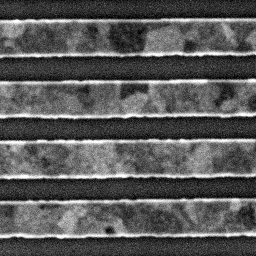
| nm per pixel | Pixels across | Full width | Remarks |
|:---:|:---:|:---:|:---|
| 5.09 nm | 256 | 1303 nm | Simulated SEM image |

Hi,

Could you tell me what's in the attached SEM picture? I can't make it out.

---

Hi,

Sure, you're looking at lines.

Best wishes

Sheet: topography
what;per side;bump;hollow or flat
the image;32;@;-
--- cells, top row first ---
--------------------------------
--------------------------------
--------------------@@@@@@@@@@@@
@@@@@@@@@@@@@@@@@@@@@@@@@@@@@@@@
@@@@@@@@@@@@@@@@@@@@@@@@@@@@@@@@
@@@@@@@@@@@@@@@@@@@@@@@@@@@@@@@@
@@@@@@@@@@@@@@@@@@@@@@@@@@@@@@@@
--------------------------------
--------------------------------
--------------------------------
@@@@@@@@@@@@@@@@@@@@@@@@@@@@@@@@
@@@@@@@@@@@@@@@@@@@@@@@@@@@@@@@@
@@@@@@@@@@@@@@@@@@@@@@@@@@@@@@@@
@@@@@@@@@@@@@@@@@@@@@@@@@@@@@@@@
@@@@@@@@@@@@@@@@@@@@@@-----@@---
--------------------------------
--------------------------------
--------------------------------
@@@@@@@@@@@@@@@@@@@@@@@@@@@@@@@@
@@@@@@@@@@@@@@@@@@@@@@@@@@@@@@@@
@@@@@@@@@@@@@@@@@@@@@@@@@@@@@@@@
@@@@@@@@@@@@@@@@@@@@@@@@@@@@@@@@
--------------------------------
--------------------------------
--------------------------------
@@@@@@@@@@@@@@@@@@@@@@@@@@@@@@@@
@@@@@@@@@@@@@@@@@@@@@@@@@@@@@@@@
@@@@@@@@@@@@@@@@@@@@@@@@@@@@@@@@
@@@@@@@@@@@@@@@@@@@@@@@@@@@@@@@@
@@@@@@@@@@@@@@@@@@-@@@@@@@--@---
--------------------------------
--------------------------------